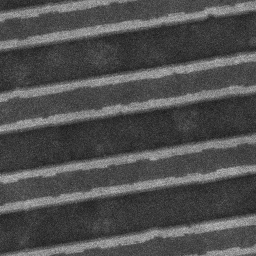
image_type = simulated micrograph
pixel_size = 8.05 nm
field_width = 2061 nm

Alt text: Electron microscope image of one or a few lines or trenches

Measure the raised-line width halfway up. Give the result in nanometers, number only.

244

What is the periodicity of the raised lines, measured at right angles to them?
644 nanometres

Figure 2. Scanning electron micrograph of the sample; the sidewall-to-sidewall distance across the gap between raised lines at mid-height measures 398 nm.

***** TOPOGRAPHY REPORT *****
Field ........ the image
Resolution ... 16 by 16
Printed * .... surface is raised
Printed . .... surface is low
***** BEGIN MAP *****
....***********.
*********.......
***.............
................
..........******
....************
**********......
***.............
................
...........*****
....************
**********......
***.............
................
...........*****
.....***********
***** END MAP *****